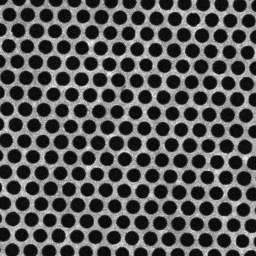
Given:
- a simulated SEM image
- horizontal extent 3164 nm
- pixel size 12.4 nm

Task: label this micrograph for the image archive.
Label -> a regular array of holes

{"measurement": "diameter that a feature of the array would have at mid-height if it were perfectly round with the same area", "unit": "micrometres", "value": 0.175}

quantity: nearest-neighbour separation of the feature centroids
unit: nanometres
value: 221